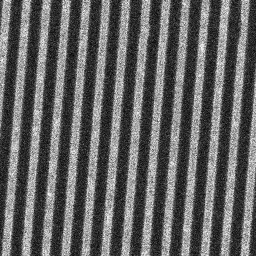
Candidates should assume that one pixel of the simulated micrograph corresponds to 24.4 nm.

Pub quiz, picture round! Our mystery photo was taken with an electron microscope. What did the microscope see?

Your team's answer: parallel lines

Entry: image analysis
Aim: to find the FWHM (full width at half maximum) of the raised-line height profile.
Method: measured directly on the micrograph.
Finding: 219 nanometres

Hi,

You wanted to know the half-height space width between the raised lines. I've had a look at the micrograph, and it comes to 261 nm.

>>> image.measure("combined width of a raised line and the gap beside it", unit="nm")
483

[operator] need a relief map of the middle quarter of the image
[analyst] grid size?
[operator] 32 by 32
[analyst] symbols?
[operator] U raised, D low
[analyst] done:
DDDUUDDDUUDDDUUDDDUUDDDUUDDDUUDD
DDDUUDDDUUDDDUUDDDUUDDDUUDDDUUDD
DDDUUDDDUUDDDUUDDDUUDDDUUDDDUUDD
DDDUUDDDUUDDDUUDDDUUDDDUUDDDUUDD
DDDUUDDDUUDDDUUDDDUUDDDUUDDDUUDD
DDDUUDDDUUDDDUUDDDUUDDDUUDDDUUDD
DDDUUDDDUUDDDUUDDDUUDDDUUDDDUUDD
DDDUUDDDUUDDUUUDDDUUDDDUUDDUUUDD
DDDUUDDUUUDDUUUDDDUUDDUUUDDUUDDD
DDUUUDDUUDDDUUUDDUUUDDUUDDDUUDDD
DDUUDDDUUDDDUUUDDUUDDDUUDDDUUDDD
DDUUDDDUUDDDUUDDDUUDDDUUDDDUUDDD
DDUUDDDUUDDDUUDDDUUDDDUUDDDUUDDD
DDUUDDDUUDDDUUDDDUUDDDUUDDDUUDDD
DDUUDDDUUDDDUUDDDUUDDDUUDDDUUDDD
DDUUDDDUUDDDUUDDDUUDDDUUDDDUUDDD
DDUUDDDUUDDDUUDDDUUDDDUUDDDUUDDD
DDUUDDDUUDDDUUDDDUUDDDUUDDDUUDDD
DDUUDDDUUDDDUUDDDUUDDDUUDDDUUDDD
DDUUDDDUUDDUUUDDDUUDDDUUDDUUUDDD
DDUUDDUUUDDUUUDDDUUDDUUUDDUUUDDD
DUUUDDUUDDDUUUDDUUUDDUUDDDUUUDDU
DUUDDDUUDDDUUUDDUUDDDUUDDDUUUDDU
DUUDDDUUDDDUUDDDUUDDDUUDDDUUDDDU
DUUDDDUUDDDUUDDDUUDDDUUDDDUUDDDU
DUUDDDUUDDDUUDDDUUDDDUUDDDUUDDDU
DUUDDDUUDDDUUDDDUUDDDUUDDDUUDDDU
DUUDDDUUDDDUUDDDUUDDDUUDDDUUDDDU
DUUDDDUUDDDUUDDDUUDDDUUDDDUUDDDU
DUUDDDUUDDDUUDDDUUDDDUUDDDUUDDDU
DUUDDDUUDDDUUDDDUUDDDUUDDDUUDDDU
DUUDDDUUDDDUUDDDUUDDDUUDDDUUDDDU